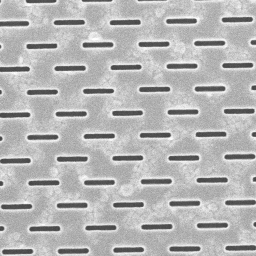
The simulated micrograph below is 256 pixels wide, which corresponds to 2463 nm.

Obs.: a regular array of holes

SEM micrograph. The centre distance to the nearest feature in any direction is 0.343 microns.